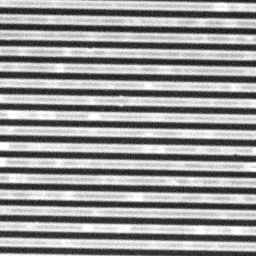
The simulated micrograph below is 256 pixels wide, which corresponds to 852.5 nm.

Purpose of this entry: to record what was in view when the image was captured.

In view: parallel lines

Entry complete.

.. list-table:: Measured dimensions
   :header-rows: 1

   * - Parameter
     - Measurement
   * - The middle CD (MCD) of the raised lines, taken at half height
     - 26.2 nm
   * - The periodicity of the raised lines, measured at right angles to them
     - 53.1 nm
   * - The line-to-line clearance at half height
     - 26.2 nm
